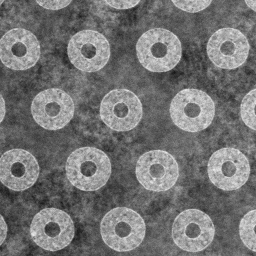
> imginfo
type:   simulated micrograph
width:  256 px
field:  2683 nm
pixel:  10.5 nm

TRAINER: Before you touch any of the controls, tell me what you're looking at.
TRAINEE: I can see a regular array of ring-shaped raised bodies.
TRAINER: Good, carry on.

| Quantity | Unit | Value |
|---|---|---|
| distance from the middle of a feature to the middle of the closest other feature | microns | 0.717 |